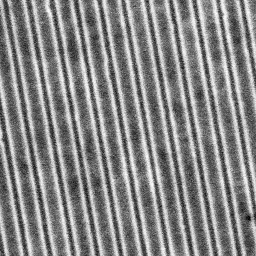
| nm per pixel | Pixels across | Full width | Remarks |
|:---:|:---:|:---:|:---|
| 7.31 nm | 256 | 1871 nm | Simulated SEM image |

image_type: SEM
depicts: parallel lines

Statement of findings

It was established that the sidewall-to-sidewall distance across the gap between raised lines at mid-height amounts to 47.7 nanometres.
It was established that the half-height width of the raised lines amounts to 123 nm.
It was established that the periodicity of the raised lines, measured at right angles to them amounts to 170 nm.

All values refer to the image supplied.